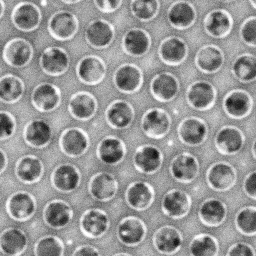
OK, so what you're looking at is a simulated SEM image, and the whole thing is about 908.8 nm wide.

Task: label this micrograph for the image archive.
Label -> a regular array of raised bodies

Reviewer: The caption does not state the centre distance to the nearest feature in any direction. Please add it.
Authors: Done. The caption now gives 132 nm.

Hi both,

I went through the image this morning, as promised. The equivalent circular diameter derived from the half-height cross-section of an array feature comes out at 0.101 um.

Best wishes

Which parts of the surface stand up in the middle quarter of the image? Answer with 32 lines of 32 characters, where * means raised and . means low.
*..*******....***...............
...*******...******.............
...*******...******.....**......
....******...*******...*****....
.....***.....******...******....
.............******...*******...
..............****....*******..*
...***................******...*
..*****................****....*
.*******....***................*
.*******...******...............
..******...******.....**........
..******..*******...******......
...****....******...******.....*
...........******..********...**
............****....******...***
.***................******...***
*****................****....***
******.....**................***
******...*****................**
******...******.....**..........
******..*******...******........
.***....*******...******........
.........******...*******...****
..........****....******...*****
**................******...*****
***................****....*****
****....***................*****
****...******...............****
****...******.....**.........*..
***...*******....****...........
**....*******...******..........